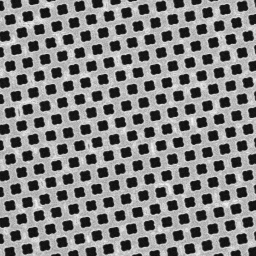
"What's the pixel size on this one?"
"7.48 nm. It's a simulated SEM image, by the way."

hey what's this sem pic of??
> a regular array of holes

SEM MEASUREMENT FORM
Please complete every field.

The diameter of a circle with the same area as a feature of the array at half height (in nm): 81.4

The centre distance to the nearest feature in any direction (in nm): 130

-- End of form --